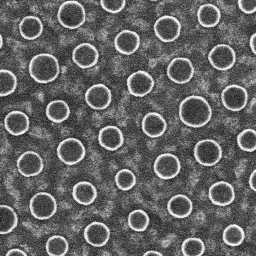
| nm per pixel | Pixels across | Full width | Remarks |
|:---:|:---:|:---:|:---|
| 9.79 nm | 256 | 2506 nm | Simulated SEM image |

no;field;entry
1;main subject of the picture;a regular array of raised bodies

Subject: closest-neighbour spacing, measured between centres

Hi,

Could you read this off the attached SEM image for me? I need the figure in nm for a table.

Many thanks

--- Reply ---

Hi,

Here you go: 418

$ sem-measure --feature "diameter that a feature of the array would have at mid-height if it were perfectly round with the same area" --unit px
23.6